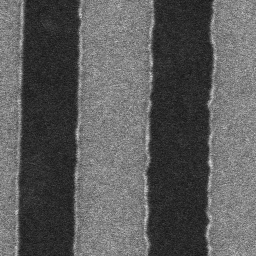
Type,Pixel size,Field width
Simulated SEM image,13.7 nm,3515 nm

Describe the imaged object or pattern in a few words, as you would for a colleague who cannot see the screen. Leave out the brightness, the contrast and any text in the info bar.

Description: one or a few lines or trenches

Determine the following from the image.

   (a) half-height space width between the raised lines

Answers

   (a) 946 nm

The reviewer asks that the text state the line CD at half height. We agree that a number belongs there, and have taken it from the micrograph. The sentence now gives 841 nanometres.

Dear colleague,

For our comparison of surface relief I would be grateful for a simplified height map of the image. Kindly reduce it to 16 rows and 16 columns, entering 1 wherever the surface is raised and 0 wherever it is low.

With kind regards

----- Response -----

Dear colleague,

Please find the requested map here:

0111100001111000
0111100001111000
0111100001111000
0111100001111000
0111100001111000
0111100001111000
0111100001111000
0111100001111000
0111100001111000
0111100001111000
0111100001111000
0111100001111000
0111100001111000
0111100001111000
0111100001111000
0111100001111000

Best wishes